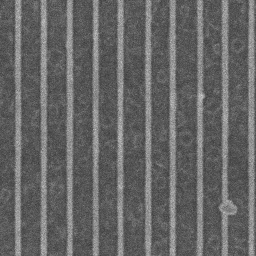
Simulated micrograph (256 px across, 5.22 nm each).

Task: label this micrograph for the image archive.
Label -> parallel lines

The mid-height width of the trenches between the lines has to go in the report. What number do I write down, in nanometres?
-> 112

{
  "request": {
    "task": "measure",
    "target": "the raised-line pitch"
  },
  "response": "0.135 um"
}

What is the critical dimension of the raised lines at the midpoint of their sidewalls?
4.37 px